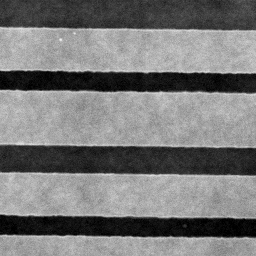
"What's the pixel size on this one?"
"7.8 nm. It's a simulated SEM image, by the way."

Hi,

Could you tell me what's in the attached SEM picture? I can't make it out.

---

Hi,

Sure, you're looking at lines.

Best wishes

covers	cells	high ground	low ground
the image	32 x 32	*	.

................................
................................
................................
*...............................
********************************
********************************
********************************
********************************
********************************
................................
................................
*********.**....................
********************************
********************************
********************************
********************************
********************************
********************************
................................
................................
................................
................................
********************************
********************************
********************************
********************************
********************************
................................
................................
**..............................
********************************
********************************